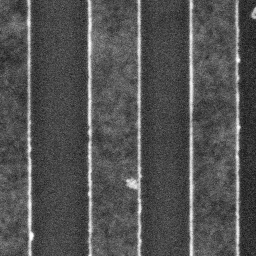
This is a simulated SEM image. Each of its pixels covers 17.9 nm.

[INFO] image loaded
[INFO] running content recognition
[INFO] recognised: lines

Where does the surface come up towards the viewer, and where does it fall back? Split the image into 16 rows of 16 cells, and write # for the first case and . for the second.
##....###...###.
##....###...###.
##....###...###.
##....###...###.
##....###...###.
##....###...###.
##....###...###.
##....###...###.
##....###...###.
##....###...###.
##....###...###.
##....###...###.
##....###...###.
##....###...###.
##....###...###.
##....###...###.